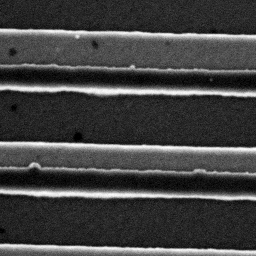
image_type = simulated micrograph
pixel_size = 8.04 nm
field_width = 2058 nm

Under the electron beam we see lines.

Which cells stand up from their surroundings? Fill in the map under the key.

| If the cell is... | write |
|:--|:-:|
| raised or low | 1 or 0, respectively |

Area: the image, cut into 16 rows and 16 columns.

0000000000000000
0000000000000000
1111111111111111
1111111111111111
1111111111111111
0111111111111111
0000000000000000
0000000000000000
0000000000000000
1111111111111111
1111111111111111
1111111111111111
0000000000000000
0000000000000000
0000000000000000
1111111000000000